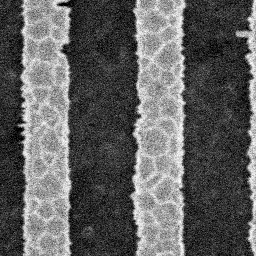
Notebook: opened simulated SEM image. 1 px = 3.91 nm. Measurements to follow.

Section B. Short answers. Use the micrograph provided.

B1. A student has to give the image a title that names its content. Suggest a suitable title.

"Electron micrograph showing one or a few lines or trenches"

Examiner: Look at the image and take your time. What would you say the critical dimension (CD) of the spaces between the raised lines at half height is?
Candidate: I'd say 0.273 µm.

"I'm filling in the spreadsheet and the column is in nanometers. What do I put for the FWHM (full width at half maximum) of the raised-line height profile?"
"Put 168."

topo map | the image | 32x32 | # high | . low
...#####.........######.........
...######........######.........
...######........######........#
...#####.........######........#
...###.#.........######.......##
...#####.........######........#
...#####.........######........#
...#.###.........######........#
...#####..........#####.........
...#####.........######.........
...#####.........######.........
...#####.........######........#
...#####..........#####........#
...#####.........######.........
...#####..........#####.........
...#####.........######........#
...#####.........######........#
...#####.........######.........
...#####.........######........#
...#####.........######........#
...#####.........######........#
...#####.........######........#
...######........######........#
...######........#####.........#
...#####.........######.........
...######........######.........
...#####.........######.........
...#####.........######.........
...#####.........######........#
...#####.........######........#
...#####.........######.........
...######........######.........